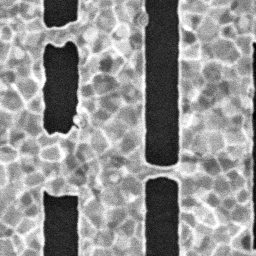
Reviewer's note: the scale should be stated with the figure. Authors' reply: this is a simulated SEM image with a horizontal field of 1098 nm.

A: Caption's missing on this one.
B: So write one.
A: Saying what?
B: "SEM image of one or a few lines or trenches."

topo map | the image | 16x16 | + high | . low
+++..++++..+++++
+++.+++++..+++++
+++++++++..+++++
+++..++++..+++++
+++..++++..+++++
+++..++++..+++++
+++..++++..+++++
+++..++++..+++++
+++++++++..+++++
+++++++++..+++++
++++++++++++++++
+++++++++..+++++
+++..++++..+++++
+++..++++..+++++
+++..++++..+++++
+++..++++..+++++